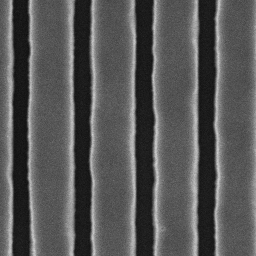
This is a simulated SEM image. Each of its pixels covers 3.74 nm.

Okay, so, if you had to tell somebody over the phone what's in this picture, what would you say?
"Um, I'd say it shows lines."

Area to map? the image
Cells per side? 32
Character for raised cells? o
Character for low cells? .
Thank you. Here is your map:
o...ooooo..oooooo..oooooo..ooooo
o...ooooo..oooooo..oooooo..ooooo
o...ooooo..oooooo..oooooo..ooooo
oo..ooooo..oooooo..oooooo..ooooo
o...ooooo..oooooo..oooooo..ooooo
oo..ooooo..oooooo..oooooo..ooooo
oo..ooooo..oooooo..oooooo..ooooo
oo..ooooo..oooooo..oooooo..ooooo
oo..ooooo..oooooo..oooooo..ooooo
oo..ooooo...ooooo..oooooo..ooooo
oo..ooooo...ooooo..oooooo..ooooo
oo..ooooo...ooooo..oooooo..ooooo
oo..ooooo...ooooo..oooooo..ooooo
oo..ooooo..oooooo..oooooo..ooooo
oo..ooooo..oooooo..oooooo..ooooo
oo..ooooo..oooooo..oooooo..ooooo
oo..ooooo..oooooo..oooooo..ooooo
oo..ooooo..oooooo..oooooo..ooooo
o...ooooo..oooooo..oooooo..ooooo
oo..ooooo..oooooo..oooooo..ooooo
oo..ooooo..oooooo..oooooo..ooooo
o...ooooo..oooooo..oooooo..ooooo
o...ooooo..oooooo..oooooo..ooooo
oo..ooooo...ooooo..oooooo..ooooo
oo..ooooo..oooooo..oooooo..ooooo
oo..ooooo..oooooo..oooooo..ooooo
oo..ooooo..oooooo..oooooo..ooooo
oo..ooooo..oooooo..oooooo..ooooo
oo..ooooo...ooooo..oooooo..ooooo
o...ooooo..oooooo..oooooo..ooooo
o...ooooo..oooooo..oooooo..ooooo
o...ooooo...ooooo..oooooo..ooooo